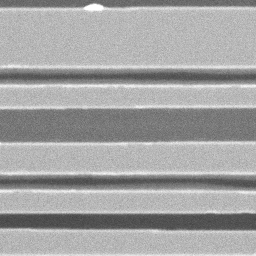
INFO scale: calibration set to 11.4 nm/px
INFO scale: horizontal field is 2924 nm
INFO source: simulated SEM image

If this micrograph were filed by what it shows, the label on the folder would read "lines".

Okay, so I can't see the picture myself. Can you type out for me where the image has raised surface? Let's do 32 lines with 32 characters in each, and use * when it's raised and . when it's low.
................................
********************************
********************************
********************************
********************************
********************************
********************************
********************************
*...**************.*...*********
................................
................................
********************************
********************************
................................
................................
................................
................................
................................
********************************
********************************
********************************
********************************
................................
................................
********************************
********************************
********************************
................................
................................
********************************
********************************
********************************